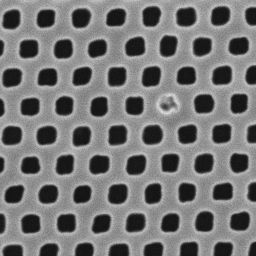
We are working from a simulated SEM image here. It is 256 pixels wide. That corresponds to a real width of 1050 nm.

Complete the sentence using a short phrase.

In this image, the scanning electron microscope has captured a regular array of holes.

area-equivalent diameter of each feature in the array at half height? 79.1 nanometers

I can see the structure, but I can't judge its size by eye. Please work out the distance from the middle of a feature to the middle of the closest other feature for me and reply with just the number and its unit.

138 nanometres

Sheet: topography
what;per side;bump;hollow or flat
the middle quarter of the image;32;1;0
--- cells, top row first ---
11111111111111111111111111111111
11100001111000001111000011111000
11000001111000001111000011110000
11000001111000001111000011110000
11000011111000011111000011110000
11111111111111111111001111111111
11111111111111111111111111111111
11111111111111111111111111111111
01111111000111110001111111111111
00111110000111100000111111111111
00111110000111100000111111111111
00111100000111100000111111111111
01111110001111110001111111111111
11111111111111111111111111111111
11111111111111111111111111111111
11111111111100111111100011111100
11100001111000011111000011111000
11000001111000001111000011110000
11000001111000001111000011110000
11000011111000011111000011111000
11111111111111111111111111111111
11111111111111111111111111111111
11111111111111111111111111001111
00111110000111111000111110000111
00111110000011110000011110000111
00111100000111110000111100000111
00111100000111110000111110001111
11111111011111111001111111111111
11111111111111111111111111111111
11111111111111111111111111111111
11110011111100001111100011111000
11100001111000001111000011111000